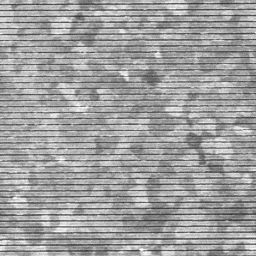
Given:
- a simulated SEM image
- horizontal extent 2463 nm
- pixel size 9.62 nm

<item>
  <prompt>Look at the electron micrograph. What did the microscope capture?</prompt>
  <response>parallel lines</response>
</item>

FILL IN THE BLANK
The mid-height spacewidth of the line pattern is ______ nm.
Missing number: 18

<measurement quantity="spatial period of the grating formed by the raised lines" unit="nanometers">57.9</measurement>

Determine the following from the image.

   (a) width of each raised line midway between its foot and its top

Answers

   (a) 39.7 nm